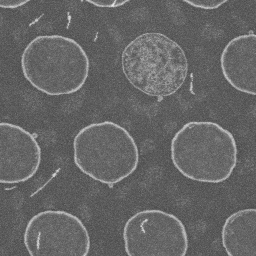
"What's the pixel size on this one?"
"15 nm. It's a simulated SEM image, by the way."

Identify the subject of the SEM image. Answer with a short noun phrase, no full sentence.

raised bodies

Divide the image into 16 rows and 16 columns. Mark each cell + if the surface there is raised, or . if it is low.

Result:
................
................
..++...........+
.++++.........++
..+++.........++
..+++..........+
................
................
++...+++...+++..
++...++++..++++.
++...+++...++++.
................
................
..++....+++....+
..+++...+++...++
..+++...++++..++